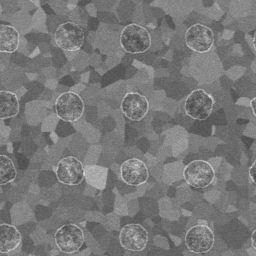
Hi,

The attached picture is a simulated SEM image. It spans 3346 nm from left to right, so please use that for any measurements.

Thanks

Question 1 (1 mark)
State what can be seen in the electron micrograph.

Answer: a regular array of holes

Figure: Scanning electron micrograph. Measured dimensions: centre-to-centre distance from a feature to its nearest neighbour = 0.842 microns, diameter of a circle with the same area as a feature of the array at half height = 365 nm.